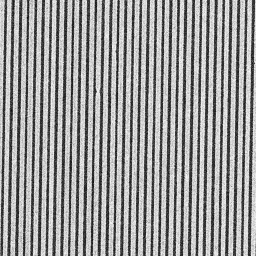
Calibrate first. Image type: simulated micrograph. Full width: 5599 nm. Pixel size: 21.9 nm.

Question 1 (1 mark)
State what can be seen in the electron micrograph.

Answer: parallel lines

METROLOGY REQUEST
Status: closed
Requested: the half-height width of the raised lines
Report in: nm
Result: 95.7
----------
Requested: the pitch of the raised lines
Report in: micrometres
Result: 0.164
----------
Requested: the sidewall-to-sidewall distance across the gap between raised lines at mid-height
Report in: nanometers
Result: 76.5